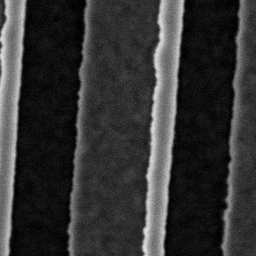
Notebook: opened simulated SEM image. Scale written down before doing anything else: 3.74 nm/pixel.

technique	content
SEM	lines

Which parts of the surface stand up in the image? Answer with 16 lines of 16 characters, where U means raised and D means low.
UUDDDUUUUUUDDDDU
UUDDDUUUUUUDDDDU
UDDDDUUUUUUDDDDU
UDDDDUUUUUUDDDDU
UDDDDUUUUUUDDDDU
UDDDDUUUUUUDDDDU
UDDDDUUUUUUDDDDU
UDDDDUUUUUUDDDDU
UDDDDUUUUUUDDDUU
UDDDDUUUUUUDDDUU
UDDDDUUUUUUDDDUU
UDDDDUUUUUUDDDUU
UDDDUUUUUUDDDDUU
UDDDUUUUUUDDDDUU
UDDDUUUUUUDDDDUU
UDDDUUUUUUDDDDUU